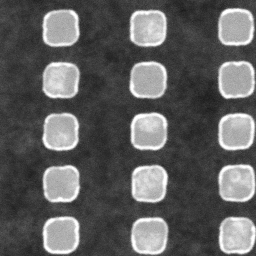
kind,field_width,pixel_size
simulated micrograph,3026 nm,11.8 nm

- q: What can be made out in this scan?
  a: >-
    a regular array of raised bodies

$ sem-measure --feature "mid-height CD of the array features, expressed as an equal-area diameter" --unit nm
441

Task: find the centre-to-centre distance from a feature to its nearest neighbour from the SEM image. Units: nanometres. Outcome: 614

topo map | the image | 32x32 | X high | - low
--------------------------------
------XXX--------XXX--------XXX-
------XXXX------XXXXX------XXXXX
-----XXXXX------XXXXX------XXXXX
-----XXXXX------XXXXX------XXXXX
------XXX--------XXX---------X--
--------------------------------
--------------------------------
------XXXX-------XXX--------XXXX
------XXXX------XXXXX------XXXXX
------XXXX------XXXXX------XXXXX
------XXXX------XXXX--------XXX-
--------------------------------
--------------------------------
------XXX--------XXX--------XXX-
------XXXX-------XXXX------XXXXX
------XXXX-------XXXX------XXXXX
------XXXX-------XXXX------XXXXX
------XXX--------XXX--------XX--
--------------------------------
--------------------------------
------XXXX-------XXXX-------XXXX
------XXXX-------XXXX------XXXXX
------XXXX-------XXXX-------XXXX
------XXX--------XXX--------XXX-
--------------------------------
--------------------------------
------XXX--------XXX--------XXX-
------XXXX-------XXXX-------XXXX
-----XXXXX-------XXXX-------XXXX
------XXXX-------XXXX-------XXXX
------XXX--------XXX--------XXX-